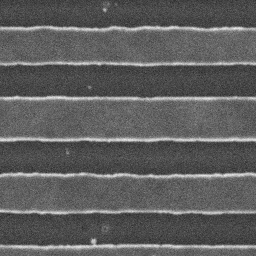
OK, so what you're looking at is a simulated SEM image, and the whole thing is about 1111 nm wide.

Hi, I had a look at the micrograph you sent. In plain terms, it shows lines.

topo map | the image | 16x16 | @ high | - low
----------------
----------------
@@@@@@@@@@@@@@@@
@@@@@@@@@@@@@@@@
----------------
----------------
@@@@@@@@@@@@@@@@
@@@@@@@@@@@@@@@@
@@@@@@@@@@@@@@@@
----------------
----------------
@@@@@@@@@@@@@@@@
@@@@@@@@@@@@@@@@
----------------
----------------
@@@@@@@@@@@@@@@@